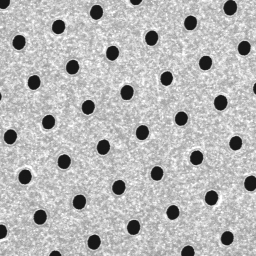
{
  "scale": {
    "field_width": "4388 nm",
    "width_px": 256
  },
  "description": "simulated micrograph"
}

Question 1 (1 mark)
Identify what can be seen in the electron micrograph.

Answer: a regular array of holes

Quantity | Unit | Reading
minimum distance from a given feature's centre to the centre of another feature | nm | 711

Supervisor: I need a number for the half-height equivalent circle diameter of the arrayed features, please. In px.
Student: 14.2